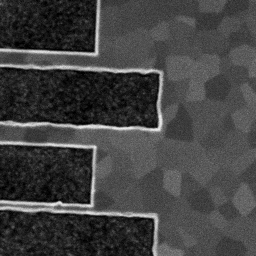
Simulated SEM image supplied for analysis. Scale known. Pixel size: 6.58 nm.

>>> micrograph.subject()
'one or a few lines or trenches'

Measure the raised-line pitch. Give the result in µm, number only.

0.483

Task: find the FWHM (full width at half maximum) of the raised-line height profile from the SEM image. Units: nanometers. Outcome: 111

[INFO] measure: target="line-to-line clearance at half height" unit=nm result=374